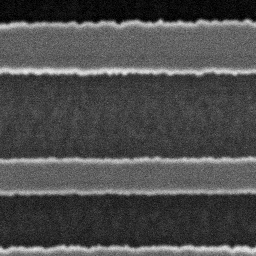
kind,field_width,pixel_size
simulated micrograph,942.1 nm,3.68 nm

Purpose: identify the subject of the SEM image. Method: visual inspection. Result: lines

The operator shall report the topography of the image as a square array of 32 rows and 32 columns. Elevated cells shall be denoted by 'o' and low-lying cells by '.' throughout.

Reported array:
................................
................................
................................
oooooooooooooooooooooooooooooooo
oooooooooooooooooooooooooooooooo
oooooooooooooooooooooooooooooooo
oooooooooooooooooooooooooooooooo
oooooooooooooooooooooooooooooooo
oooooooooooooooooooooooooooooooo
................................
................................
................................
................................
................................
................................
................................
................................
................................
................................
................................
oooooooooooooooooooooooooooooooo
oooooooooooooooooooooooooooooooo
oooooooooooooooooooooooooooooooo
oooooooooooooooooooooooooooooooo
................................
................................
................................
................................
................................
................................
................................
oooooooooooooooooooooooooooooooo